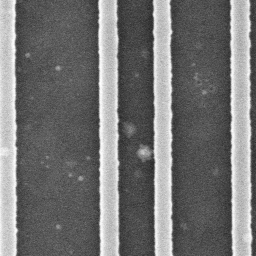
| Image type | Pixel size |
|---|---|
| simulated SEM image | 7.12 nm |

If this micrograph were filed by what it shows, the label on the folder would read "lines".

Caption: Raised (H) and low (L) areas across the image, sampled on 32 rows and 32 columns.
HHLLLLLLLLLLHHHLLLLHHLLLLLLLLHHL
HHLLLLLLLLLLHHHLLLLHHLLLLLLLLHHL
HHLLLLLLLLLLLHHLLLLHHLLLLLLLLHHL
HHLLLLLLLLLLLHHLLLLHHLLLLLLLLHHL
HHLLLLLLLLLLHHHLLLLHHLLLLLLLLHHL
HHLLLLLLLLLLHHHLLLLHHLLLLLLLLHHL
HHLLLLLLLLLLLHHLLLLHHLLLLLLLLHHL
HHLLLLLLLLLLLHHLLLLHHLLLLLLLLHHL
HHLLLLLLLLLLLHHLLLLHHLLLLLLLLHHL
HHLLLLLLLLLLLHHLLLLHHLLLLLLLLHHL
HHLLLLLLLLLLLHHLLLLHHLLLLLLLLHHL
HHLLLLLLLLLLLHHLLLLHHLLLLLLLLHHL
HHLLLLLLLLLLLHHLLLLHHLLLLLLLLHHL
HHLLLLLLLLLLLHHLLLLHHLLLLLLLLHHL
HHLLLLLLLLLLLHHLLLLHHLLLLLLLLHHL
HHLLLLLLLLLLLHHLLLLHHLLLLLLLLHHL
HHLLLLLLLLLLLHHLLLLHHLLLLLLLLHHL
HHLLLLLLLLLLLHHLLLLHHLLLLLLLLHHL
HHLLLLLLLLLLLHHLLLLHHLLLLLLLLHHL
HHLLLLLLLLLLLHHLLLLHHLLLLLLLLHHL
HHLLLLLLLLLLLHHLLLLHHLLLLLLLLHHL
HHLLLLLLLLLLLHHLLLLHHLLLLLLLLHHL
HHLLLLLLLLLLLHHLLLLHHLLLLLLLLHHL
HHLLLLLLLLLLLHHLLLLHHLLLLLLLLHHL
HHLLLLLLLLLLLHHLLLLHHLLLLLLLLHHL
HHLLLLLLLLLLLHHLLLLHHLLLLLLLLHHL
HHLLLLLLLLLLLHHLLLLHHLLLLLLLLHHL
HHLLLLLLLLLLLHHLLLLHHLLLLLLLLHHL
HHLLLLLLLLLLLHHLLLLHHLLLLLLLLHHL
HHLLLLLLLLLLLHHLLLLHHLLLLLLLLHHL
HHLLLLLLLLLLLHHLLLLHHLLLLLLLLHHL
HHLLLLLLLLLLLHHLLLLHHLLLLLLLLHHL